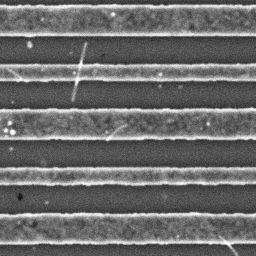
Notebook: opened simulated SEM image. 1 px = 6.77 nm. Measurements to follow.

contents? lines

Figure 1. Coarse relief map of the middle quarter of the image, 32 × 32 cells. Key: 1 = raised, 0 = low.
11111111111111111111111111111111
11111111111111111111111111111111
11111111111111111111111111111111
11111111111111111111111111111111
00010000000000000000000000000000
00000000000000000000000000000000
00000000000000000000000000000000
00000000000000000000000000000000
00000000000000000000000000000000
00000000000000000000000000000000
00000000000000000000000000000000
01110011111111111110001011100011
11111111111111111111111111111111
11111111111111111111111111111111
11111111111111111111111111111111
11111111111111111111111111111111
11111111111111111111111111111111
11111111111111111111111111111111
11111111111111111111111111111111
00000000000000000000000000000000
00000000000000000000000000000000
00000000000000000000000000000000
00000000000000000000000000000000
00000000000000000000000000000000
00000000000000000000000000000000
00000000000000000000000000000000
11111111111111111111111111111111
11111111111111111111111111111111
11111111111111111111111111111111
11111111111111111111111111111111
00000000000000000000000000000000
00000000000000000000000000000000